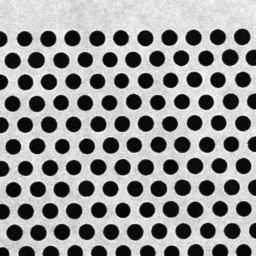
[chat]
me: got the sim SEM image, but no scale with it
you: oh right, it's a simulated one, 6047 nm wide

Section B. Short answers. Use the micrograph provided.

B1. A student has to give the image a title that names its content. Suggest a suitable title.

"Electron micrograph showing a regular array of holes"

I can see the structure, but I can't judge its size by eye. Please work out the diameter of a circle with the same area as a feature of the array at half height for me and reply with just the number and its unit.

387 nanometres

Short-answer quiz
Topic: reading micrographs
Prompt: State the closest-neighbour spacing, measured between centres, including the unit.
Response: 564 nanometers